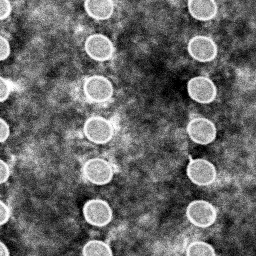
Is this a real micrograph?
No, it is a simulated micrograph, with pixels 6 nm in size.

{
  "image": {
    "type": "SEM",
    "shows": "a regular array of raised bodies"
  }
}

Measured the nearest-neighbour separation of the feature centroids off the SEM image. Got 0.246 microns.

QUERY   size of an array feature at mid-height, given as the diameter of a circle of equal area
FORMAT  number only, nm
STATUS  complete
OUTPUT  159